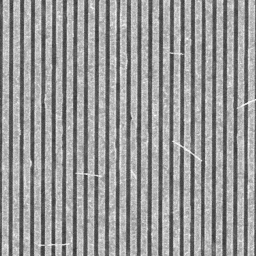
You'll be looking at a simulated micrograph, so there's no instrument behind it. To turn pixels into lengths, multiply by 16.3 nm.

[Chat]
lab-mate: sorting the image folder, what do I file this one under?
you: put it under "parallel lines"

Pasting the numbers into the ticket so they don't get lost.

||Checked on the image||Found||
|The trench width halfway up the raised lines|4.38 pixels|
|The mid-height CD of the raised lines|104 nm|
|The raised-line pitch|0.174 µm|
